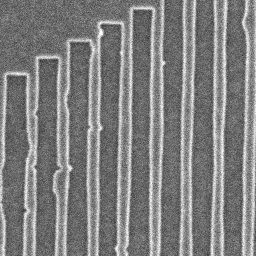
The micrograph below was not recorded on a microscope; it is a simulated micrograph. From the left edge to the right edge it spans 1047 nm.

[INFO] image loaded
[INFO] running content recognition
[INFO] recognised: parallel lines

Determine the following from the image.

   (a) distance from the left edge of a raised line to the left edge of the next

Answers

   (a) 0.127 µm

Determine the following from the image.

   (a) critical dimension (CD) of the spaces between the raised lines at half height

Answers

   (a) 85.3 nanometers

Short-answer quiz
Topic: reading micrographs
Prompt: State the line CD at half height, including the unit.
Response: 41.4 nm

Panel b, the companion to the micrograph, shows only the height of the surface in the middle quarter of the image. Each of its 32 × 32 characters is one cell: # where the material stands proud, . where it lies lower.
#......##.....###.....###.....##
#......##.....###.....##......##
#......##.....###.....##......##
#......##.....###.....###.....##
#......##.....###.....###.....##
#.....###.....###.....###.....##
#.....###.....###.....###.....##
#......##.....###.....###.....##
#......##.....###.....###.....##
#......##.....###.....###.....##
#......##.....###.....###.....##
#......##.....###.....###.....##
#......##.....###.....###.....##
#.....###.....###.....##......##
#.....###.....###.....##......##
#......##.....###.....###....###
#.....###.....###.....###....###
#.....###.....###.....##......##
#.....###.....###.....##......##
#.....###.....###.....##......##
#.....###.....###.....##......##
#.....###.....###.....##......##
#.....###.....###.....##......##
#.....###.....###.....##......##
#.....###.....###.....##......##
##....###.....###.....##......##
##....###.....###.....##......##
#.....###.....##......##......##
#.....###.....##......##......##
#.....###.....###.....##......##
#.....###.....##......##.....###
#.....###.....##......##.....###